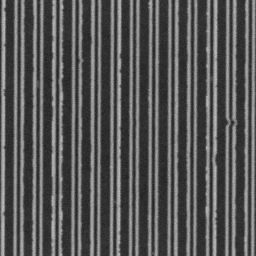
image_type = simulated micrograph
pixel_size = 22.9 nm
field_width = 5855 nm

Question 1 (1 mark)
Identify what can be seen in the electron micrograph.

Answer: parallel lines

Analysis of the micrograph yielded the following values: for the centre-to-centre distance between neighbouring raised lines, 0.441 um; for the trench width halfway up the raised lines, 292 nanometers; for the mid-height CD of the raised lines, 157 nm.